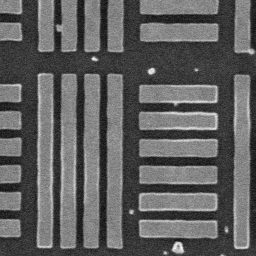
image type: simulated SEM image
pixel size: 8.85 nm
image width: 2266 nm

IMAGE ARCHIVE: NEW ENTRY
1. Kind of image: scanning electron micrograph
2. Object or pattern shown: groups of lines, slits or small figures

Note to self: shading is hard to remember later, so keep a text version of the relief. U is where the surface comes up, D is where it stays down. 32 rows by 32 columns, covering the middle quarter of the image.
DDDDDDDDDDDDDDDDDDDDDDDDDDDDDDDD
DDDDDDDDDDDDDDDDDDDDDDDDDDDDDDDD
DDDDDDDDDDDDDDDDDDDDDDDDDDDDDDDD
UUUDDUUUUDDUUUDDDDDDDDDDDDDDDDDD
UUUDDUUUUDDUUUUDDDDDDDDDDDDDDDDD
UUUDDUUUUDDUUUUDDDDDDDDDDDDDDDDD
UUUDDUUUUDDUUUDDDDDUUUUUUUUUUUUU
UUUDDUUUUDDUUUDDDDDUUUUUUUUUUUUU
UUUDDUUUUDDUUUDDDDDUUUUUUUUUUUUU
UUUDDUUUUDDUUUDDDDDUUUUDDDDDDDDD
UUUDDUUUUDDUUUDDDDDDDDDDDDDDDDDD
UUUDDUUUUDDUUUUDDDDDDDDDDDDDDDDD
UUUDDUUUUDDUUUUDDDDUUUUUUUUUUDUU
UUUDDUUUUDDUUUUDDDDUUUUUUUUUUUUU
UUUDDUUUUDDUUUDDDDDUUUUUUUUUUUUU
UUUDDUUUUDDUUUDDDDDUUUUUUUUUUUUU
UUUDDUUUUDDUUUDDDDDDDDDDDDDDDDDD
UUUDDUUUUDDUUUDDDDDDDDDDDDDDDDDD
UUUDDUUUUDDUUUDDDDDDDDDDDDDDDDDD
UUUDDUUUUDDUUUDDDDDUUUUUUUUUUUUU
UUUDDUUUUDDUUUDDDDDUUUUUUUUUUUUU
UUUDDUUUUDDUUUDDDDDUUUUUUUUUUUUU
UUUDDUUUUDDUUUDDDDDUUUUUUUUUUUUU
UUUDDUUUUDDUUUDDDDDDDDDDDDDDDDDD
UUUDDUUUUDDUUUDDDDDDDDDDDDDDDDDD
UUUDDUUUUDDUUUDDDDDDDDDDDDDDDDDD
UUUDDUUUUDDUUUDDDDDUUUUUUUUUUUUU
UUUDDUUUUDDUUUDDDDDUUUUUUUUUUUUU
UUUDDUUUUDDUUUDDDDDUUUUUUUUUUUUU
UUUDDUUUDDDUUUDDDDDUUUUUUUUUUUUU
UUUDDUUUDDDUUUDDDDDDDDDDDDDDDDDD
UUUDDUUUDDDUUUDDDDDDDDDDDDDDDDDD